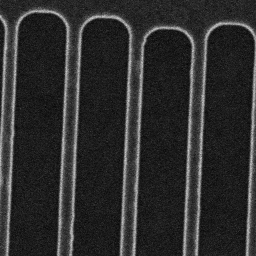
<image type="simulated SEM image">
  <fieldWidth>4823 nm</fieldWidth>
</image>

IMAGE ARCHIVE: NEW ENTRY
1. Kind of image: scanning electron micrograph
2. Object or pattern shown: parallel lines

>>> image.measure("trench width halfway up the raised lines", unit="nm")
948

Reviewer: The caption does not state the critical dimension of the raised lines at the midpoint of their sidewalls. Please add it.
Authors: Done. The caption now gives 0.242 micrometres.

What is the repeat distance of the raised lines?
1.18 micrometres